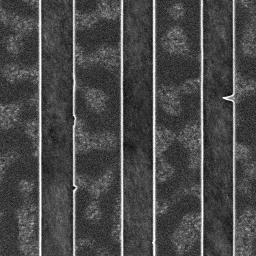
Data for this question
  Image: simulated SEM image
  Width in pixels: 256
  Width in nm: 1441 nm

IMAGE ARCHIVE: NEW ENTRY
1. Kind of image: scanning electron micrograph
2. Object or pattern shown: one or a few lines or trenches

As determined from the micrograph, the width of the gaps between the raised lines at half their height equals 178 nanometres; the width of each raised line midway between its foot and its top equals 274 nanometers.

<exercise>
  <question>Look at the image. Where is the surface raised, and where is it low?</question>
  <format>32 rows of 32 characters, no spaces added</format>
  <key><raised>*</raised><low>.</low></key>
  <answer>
*****....******....******....***
*****....******....******....***
*****....******....******....***
*****....******....******....***
*****....******....******....***
*****....******....******....***
*****....******....******....***
*****....******....******....***
*****....******....******....***
*****....******....******....***
*****....******....******....***
*****....******....******....***
*****....******....******....***
*****....******....******....***
*****....******....******....***
*****....******....******....***
*****....******....******....***
*****....******....******....***
*****....******....******....***
*****....******....******....***
*****....******....******....***
*****....******....******....***
*****....******....******....***
*****....******....******....***
*****....******....******....***
*****....******....******....***
*****....******....******....***
*****....******....******....***
*****....******....******....***
*****....******....******....***
*****....******....******....***
*****....******....******....***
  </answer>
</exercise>